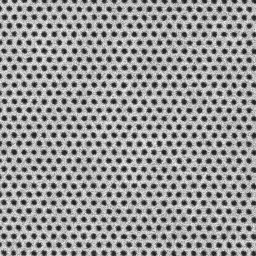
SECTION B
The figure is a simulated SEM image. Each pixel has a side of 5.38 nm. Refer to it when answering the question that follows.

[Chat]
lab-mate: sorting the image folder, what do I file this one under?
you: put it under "a regular array of holes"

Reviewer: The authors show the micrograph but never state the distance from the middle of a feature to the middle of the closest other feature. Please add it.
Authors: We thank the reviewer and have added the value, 50.2 nm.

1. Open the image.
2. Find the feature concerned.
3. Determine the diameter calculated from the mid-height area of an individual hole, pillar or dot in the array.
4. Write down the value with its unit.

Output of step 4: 31.5 nm